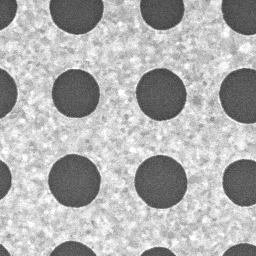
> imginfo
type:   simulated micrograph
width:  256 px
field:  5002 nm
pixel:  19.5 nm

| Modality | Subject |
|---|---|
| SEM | holes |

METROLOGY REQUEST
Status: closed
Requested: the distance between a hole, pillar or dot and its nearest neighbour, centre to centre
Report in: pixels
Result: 85.8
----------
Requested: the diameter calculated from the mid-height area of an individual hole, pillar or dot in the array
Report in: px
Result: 53.1